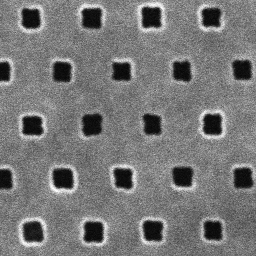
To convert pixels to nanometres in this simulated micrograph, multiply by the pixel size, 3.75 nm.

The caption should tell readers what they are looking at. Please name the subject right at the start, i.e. a regular array of holes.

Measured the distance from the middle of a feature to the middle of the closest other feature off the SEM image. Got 59.7 px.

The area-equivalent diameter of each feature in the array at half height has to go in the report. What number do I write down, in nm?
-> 83